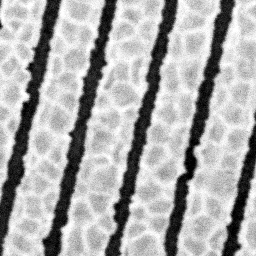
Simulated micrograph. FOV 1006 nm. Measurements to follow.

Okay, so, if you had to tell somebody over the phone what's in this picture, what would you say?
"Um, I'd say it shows parallel lines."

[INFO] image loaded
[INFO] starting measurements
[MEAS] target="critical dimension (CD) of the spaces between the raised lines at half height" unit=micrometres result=0.0565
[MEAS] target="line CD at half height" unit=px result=41.1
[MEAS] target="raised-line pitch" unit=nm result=224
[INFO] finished